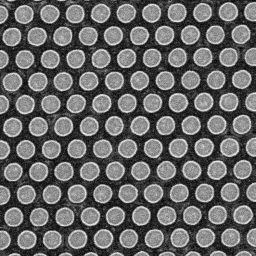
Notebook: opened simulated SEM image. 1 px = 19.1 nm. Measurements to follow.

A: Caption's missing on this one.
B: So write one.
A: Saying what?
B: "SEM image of a regular array of raised bodies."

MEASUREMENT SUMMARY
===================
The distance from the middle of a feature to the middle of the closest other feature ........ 0.485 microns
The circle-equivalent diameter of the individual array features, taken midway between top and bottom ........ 345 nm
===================